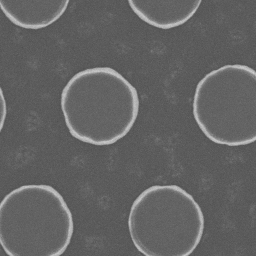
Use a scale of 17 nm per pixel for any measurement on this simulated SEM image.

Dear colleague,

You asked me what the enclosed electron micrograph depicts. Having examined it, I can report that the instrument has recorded raised bodies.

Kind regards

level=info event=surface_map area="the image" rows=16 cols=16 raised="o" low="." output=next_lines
oooo....oooo....
.oo.......o.....
................
................
.....oo......ooo
....oooo....oooo
....oooo....oooo
....oooo....oooo
.....oo......ooo
................
................
................
oooo.....ooo....
oooo....ooooo...
oooo....ooooo...
oooo.....ooo....